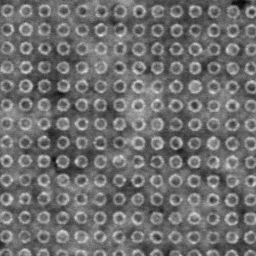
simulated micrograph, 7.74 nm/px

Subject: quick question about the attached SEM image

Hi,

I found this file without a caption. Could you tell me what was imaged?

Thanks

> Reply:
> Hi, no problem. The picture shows a regular array of raised bodies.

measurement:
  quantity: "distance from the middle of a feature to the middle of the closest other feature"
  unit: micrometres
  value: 0.143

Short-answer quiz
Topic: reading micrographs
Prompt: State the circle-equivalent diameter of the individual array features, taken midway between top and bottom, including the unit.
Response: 0.0824 micrometres